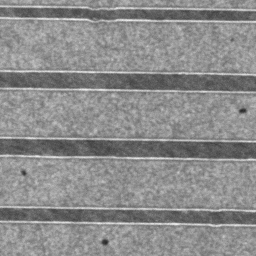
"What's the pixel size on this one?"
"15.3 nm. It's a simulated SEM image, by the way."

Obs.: one or a few lines or trenches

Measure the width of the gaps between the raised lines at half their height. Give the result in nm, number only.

774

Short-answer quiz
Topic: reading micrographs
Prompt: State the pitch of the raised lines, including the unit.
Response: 1030 nanometers